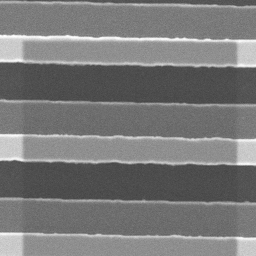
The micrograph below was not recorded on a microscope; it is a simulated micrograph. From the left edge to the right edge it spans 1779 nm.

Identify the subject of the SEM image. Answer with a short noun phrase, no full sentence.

lines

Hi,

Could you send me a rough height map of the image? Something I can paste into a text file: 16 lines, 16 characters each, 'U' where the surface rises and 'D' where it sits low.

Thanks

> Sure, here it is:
UUUUUUUUUUUUUUUU
UUUUUUUUUUUUUUUU
UUUUUUUUUUUUUUUU
UUUUUUUUUUUUUUUU
DDDDDDDDDDDDDDDD
DDDDDDDDDDDDDDDD
UUUUUUUUUUUUDDDD
UUUUUUUUUUUUUUUU
UUUUUUUUUUUUUUUU
UUUUUUUUUUUUUUUU
DDDDDDDDDDDDDDDD
DDDDDDDDDDDDDDDD
UUUUDDDDDDDDDDDD
UUUUUUUUUUUUUUUU
UUUUUUUUUUUUUUUU
UUUUUUUUUUUUUUUU